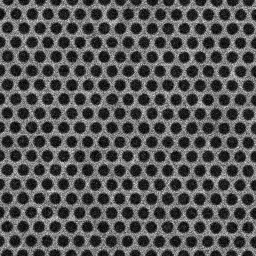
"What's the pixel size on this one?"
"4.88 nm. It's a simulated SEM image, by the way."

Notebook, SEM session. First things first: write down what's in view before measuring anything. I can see a regular array of holes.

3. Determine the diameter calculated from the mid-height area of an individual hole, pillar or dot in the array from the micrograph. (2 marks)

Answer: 61.1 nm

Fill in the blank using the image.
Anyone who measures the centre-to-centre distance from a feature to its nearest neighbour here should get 15.9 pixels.